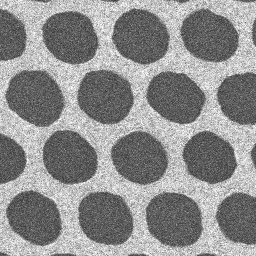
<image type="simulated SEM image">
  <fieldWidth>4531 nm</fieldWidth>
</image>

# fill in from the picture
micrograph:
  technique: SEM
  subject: a regular array of holes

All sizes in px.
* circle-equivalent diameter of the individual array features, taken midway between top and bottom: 54.8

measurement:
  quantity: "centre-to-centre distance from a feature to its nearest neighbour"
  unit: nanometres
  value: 1220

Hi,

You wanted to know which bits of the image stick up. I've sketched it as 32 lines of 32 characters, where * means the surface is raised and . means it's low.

********************************
.*******.*******...*****...*****
..****.....****.....***......***
...**.......**.......**......**.
...**.......**.......**.......*.
...***......**.......**.......**
...***......***......***.....***
.******....*****....*****...****
********************************
**....*****....****....******...
*......***......***......***....
*.......**.......*.......**.....
*.......**.......*........*.....
*.......**......***......***....
**......***.....****.....***....
****...******.****************..
*******..********.*******.******
..****.....****.....****....****
...**.......**.......**......***
...**.......**.......**......**.
...***......**.......**.......**
...***......***......**......***
..*****....*****....*****...****
********************************
**....*****....****....******...
*......***......***......**.....
*......***......**.......**.....
*.......**.......*.......**.....
*.......**.......*.......**.....
***....****.....***......***....
****..*******..*****....******..
********************************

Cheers